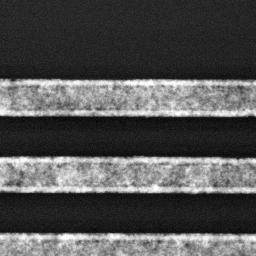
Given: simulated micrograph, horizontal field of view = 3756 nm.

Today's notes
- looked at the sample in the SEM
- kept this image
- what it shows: one or a few lines or trenches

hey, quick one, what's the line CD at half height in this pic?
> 418 nm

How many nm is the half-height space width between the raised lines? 719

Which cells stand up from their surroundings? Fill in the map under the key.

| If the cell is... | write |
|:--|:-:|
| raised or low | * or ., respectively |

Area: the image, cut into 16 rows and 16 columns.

................
................
................
................
................
****************
****************
................
................
................
****************
****************
................
................
................
****************